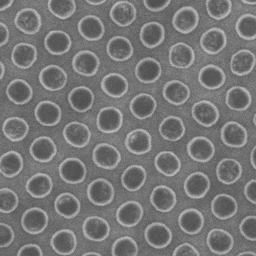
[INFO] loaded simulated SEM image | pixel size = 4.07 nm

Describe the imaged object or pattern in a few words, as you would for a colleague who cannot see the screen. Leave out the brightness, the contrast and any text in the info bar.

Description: a regular array of raised bodies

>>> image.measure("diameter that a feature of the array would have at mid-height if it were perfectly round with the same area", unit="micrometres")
0.1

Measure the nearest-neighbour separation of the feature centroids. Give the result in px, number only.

35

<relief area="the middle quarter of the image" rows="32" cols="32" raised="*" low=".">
..******..........******....***.
...*****..........******........
.....**...........******........
*.........*****....****.........
..........******.....*.....**...
..........******..........****..
..****....******.........******.
..*****....****..........******.
.******...........****...******.
..*****..........******....***..
..*****..........******.........
...***...****....******.........
.........*****...*****..........
........******....**......**....
........******...........****...
.****....*****..........******..
******...****......*....******..
******...........****...******..
******..........*****....****...
.*****..........*****...........
...**....***....******.........*
........*****...*****..........*
.......*******..........***....*
........******.........*****....
****....*****..........******...
*****....****....*.....******...
*****...........****....*****...
*****..........*****.....**.....
*****.........******...........*
.**....****....*****..........**
......******...****...........**
......******....**....*****...**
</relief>